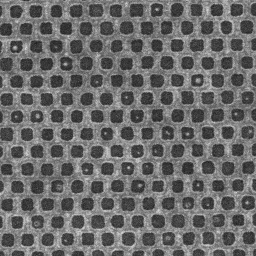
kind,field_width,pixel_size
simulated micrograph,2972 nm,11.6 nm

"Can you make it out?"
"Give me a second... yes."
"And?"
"a regular array of holes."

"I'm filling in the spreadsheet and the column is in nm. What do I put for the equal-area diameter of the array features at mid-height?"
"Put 165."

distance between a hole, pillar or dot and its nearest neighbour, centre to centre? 0.23 micrometres